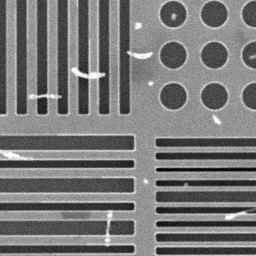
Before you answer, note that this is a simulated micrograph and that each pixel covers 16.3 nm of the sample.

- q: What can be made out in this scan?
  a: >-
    groups of lines, slits or small figures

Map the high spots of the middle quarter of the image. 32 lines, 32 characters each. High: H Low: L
LHHLLLHHHLLLHHLLLHHHHHHHHLLLLLHH
LHHHLLHHHLLLHHLLLHHHHHHHHHHHHHHH
LHHHHLHHHHLLHHLLLHHHHHHHHHHHHHHH
LHHLLLHHHLLLHHLLLHHHHHHHHHHHHHHH
LHHLLLHHHLLLHHLLLHHHHHHHHHHHHHHH
LHHLLLHHHLLLHHLLLHHHHHHHHLLLLLHH
LHHLLLHHHLLLHHLLLHHHHHHHLLLLLLHH
LHHLLLHHHLLLHHLLLHHHHHHHLLLLLLLH
LHHLLLHHHLLLHHLLLHHHHHHHLLLLLLLH
LHHLLLHHHLLLHHLLLHHHHHHHLLLLLLLH
LHHLLLHHHLLLHHLLLHHHHHHHHLLLLLHH
LHHLLLHHHLLLHHLLLHHHHHHHHHLLHHHH
LHHHLLHHHLLHHHLLHHHHHHHHHHHHHHHH
HHHHHHHHHHHHHHHHHHHHHHHHHHHHHHHH
HHHHHHHHHHHHHHHHHHHHHHHHHHHHHHHH
HHHHHHHHHHHHHHHHHHHHHHHHHHHHHHHH
HHHHHHHHHHHHHHHHHHHHHHHHHHHHHHHH
HHHHHHHHHHHHHHHHHHHHHHHHHHHHHHHH
LLLLLLLLLLLLLLLLLLHHHHHLLLLLLLLL
LLLLLLLLLLLLLLLLLLHHHHHLLLLLLLLL
LLLLLLLLLLLLLLLLLLHHHHHLLLLLLLLL
LLLLLLLLLLLLLLLLLHHHHHHHHHHHHHHH
HHHHHHHHHHHHHHHHHHHHHHHLLLLLLLLL
HHHHHHHHHHHHHHHHHHHHHHHLLLLLLLLL
LLLLLLLLLLLLLLLLLLHHHHHHHHHHHHHH
LLLLLLLLLLLLLLLLLLHHHHHHHHHHHHHH
HHHHHHHHHHHHHHHHHHHHHHHLLLLLLLLL
HHHHHHHHHHHHHHHHHHHHHHHHHHHHHHHH
LLLLLLLLLLLLLLLLLHHHHHHHHHHHHHHH
LLLLLLLLLLLLLLLLLLHHHHHLLLLLLLLL
LLLLLLLLLLLLLLLLLLHHHHHLLLLLLLLL
LLLLLLLLLLLLLLLLLLHHHHHHHHHHHHHH